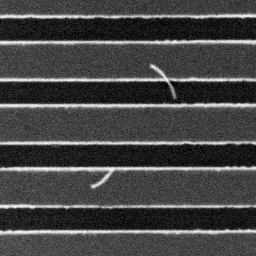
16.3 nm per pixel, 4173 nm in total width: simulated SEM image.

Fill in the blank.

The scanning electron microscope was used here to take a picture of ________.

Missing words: lines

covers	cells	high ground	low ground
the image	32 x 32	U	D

UUUUUUUUUUUUUUUUUUUUUUUUUUUUUUUU
UUUUUUUUUUUUUUUUUUUUUUUUUUUUUUUU
DDDDDDDDDDDDDDDDDDDDDDDDDDDDDDDD
DDDDDDDDDDDDDDDDDDDDDDDDDDDDDDDD
DDDDDDDDDDDDDDDDDDDDDDDDDDDDDDDD
UUUUUUUUUUUUUUUUUUUUUUUUUUUUUUUU
UUUUUUUUUUUUUUUUUUUUUUUUUUUUUUUU
UUUUUUUUUUUUUUUUUUUUUUUUUUUUUUUU
UUUUUUUUUUUUUUUUUUUUUUUUUUUUUUUU
UUUUUUUUUUUUUUUUUUUUUUUUUUUUUUUU
DDDDDDDDDDDDDDDDDDDDDDDDDDDDDDDD
DDDDDDDDDDDDDDDDDDDDDDDDDDDDDDDD
DDDDDDDDDDDDDDDDDDDDDDDDDDDDDDDD
UUUUUUUUUUUUUUUUUUUUUUUUUUUUUUUU
UUUUUUUUUUUUUUUUUUUUUUUUUUUUUUUU
UUUUUUUUUUUUUUUUUUUUUUUUUUUUUUUU
UUUUUUUUUUUUUUUUUUUUUUUUUUUUUUUU
UUUUUUUUUUUUUUUUUUUUUUUUUUUUUUUU
DDDDDDDDDDDDDDDDDDDDDDDDDDDDDDDD
DDDDDDDDDDDDDDDDDDDDDDDDDDDDDDDD
DDDDDDDDDDDDDDDDDDDDDDDDDDDDDDDD
UUUUUUUUUUUUUUUUUUUUUUUUUUUUUUUU
UUUUUUUUUUUUUUUUUUUUUUUUUUUUUUUU
UUUUUUUUUUUUUUUUUUUUUUUUUUUUUUUU
UUUUUUUUUUUUUUUUUUUUUUUUUUUUUUUU
UUUUUUUUUUUUUUUUUUUUUUUUUUUUUUUU
DDDDDDDDDDDDDDDDDDDDDDDDDDDDDDDD
DDDDDDDDDDDDDDDDDDDDDDDDDDDDDDDD
DDDDDDDDDDDDDDDDDDDDDDDDDDDDDDDD
UUUUUUUUUUUUUUUUUUUUUUUUUUUUUUUU
UUUUUUUUUUUUUUUUUUUUUUUUUUUUUUUU
UUUUUUUUUUUUUUUUUUUUUUUUUUUUUUUU